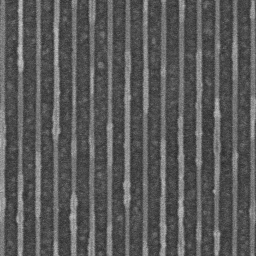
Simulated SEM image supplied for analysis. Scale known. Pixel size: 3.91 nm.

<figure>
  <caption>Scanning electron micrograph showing parallel lines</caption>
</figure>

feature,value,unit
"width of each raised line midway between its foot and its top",13.7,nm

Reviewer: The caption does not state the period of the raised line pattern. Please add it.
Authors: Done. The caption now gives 70 nm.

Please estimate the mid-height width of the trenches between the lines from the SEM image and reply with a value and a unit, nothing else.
0.0548 µm